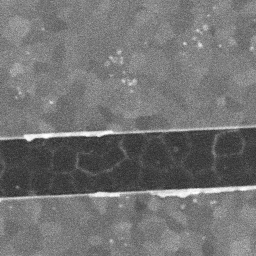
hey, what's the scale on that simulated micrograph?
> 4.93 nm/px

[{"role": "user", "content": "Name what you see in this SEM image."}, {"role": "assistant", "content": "one or a few lines or trenches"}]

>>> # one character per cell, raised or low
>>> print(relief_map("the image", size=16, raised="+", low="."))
++++++++++++++++
++++++++++++++++
++++++++++++++++
++++++++++++++++
++++++++++++++++
++++++++++++++++
++++++++++++++++
++++++++++++++++
++++++..........
................
................
................
++++++++++++++++
++++++++++++++++
++++++++++++++++
++++++++++++++++